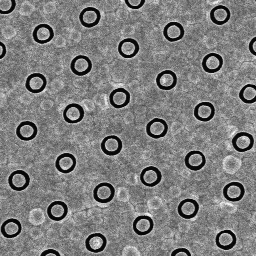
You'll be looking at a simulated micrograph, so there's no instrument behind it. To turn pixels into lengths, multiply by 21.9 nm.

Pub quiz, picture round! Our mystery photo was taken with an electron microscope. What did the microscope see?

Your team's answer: a regular array of ring-shaped grooves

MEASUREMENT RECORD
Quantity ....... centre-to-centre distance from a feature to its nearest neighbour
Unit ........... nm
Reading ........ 1060